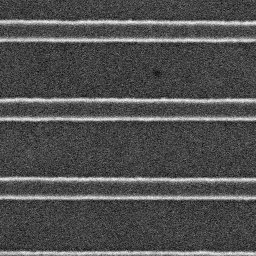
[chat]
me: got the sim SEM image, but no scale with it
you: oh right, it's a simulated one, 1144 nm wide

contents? lines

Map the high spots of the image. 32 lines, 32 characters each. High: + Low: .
................................
................................
................................
++++++++++++++++++++++++++++++++
++++++++++++++++++++++++++++++++
................................
................................
................................
................................
................................
................................
................................
++++++++++++++++++++++++++++++++
++++++++++++++++++++++++++++++++
++++++++++++++++++++++++++++++++
................................
................................
................................
................................
................................
................................
................................
++++++++++++++++++++++++++++++++
++++++++++++++++++++++++++++++++
++++++++++++++++++++++++++++++++
................................
................................
................................
................................
................................
................................
................................